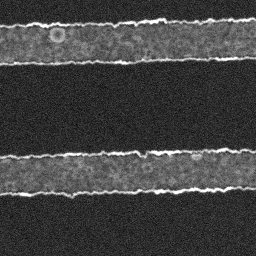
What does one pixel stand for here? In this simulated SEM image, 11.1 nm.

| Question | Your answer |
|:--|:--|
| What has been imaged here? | one or a few lines or trenches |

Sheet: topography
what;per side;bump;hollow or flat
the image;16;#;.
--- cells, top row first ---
################
#########.......
................
................
################
################
################
################
################
#############...
................
................
################
################
################
################